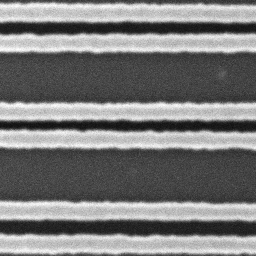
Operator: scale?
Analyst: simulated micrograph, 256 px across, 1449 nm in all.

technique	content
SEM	lines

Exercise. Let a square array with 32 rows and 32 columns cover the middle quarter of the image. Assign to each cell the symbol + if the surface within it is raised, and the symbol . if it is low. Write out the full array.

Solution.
................................
................................
................................
................................
................................
................................
................................
................................
................................
................................
++++++++++++++++++++++++++++++++
++++++++++++++++++++++++++++++++
++++++++++++++++++++++++++++++++
++++++++++++++++++++++++++++++++
................................
................................
................................
++++++++++++++++++++++++++++++++
++++++++++++++++++++++++++++++++
++++++++++++++++++++++++++++++++
++++++++++++++++++.+++++++++++++
................................
................................
................................
................................
................................
................................
................................
................................
................................
................................
................................